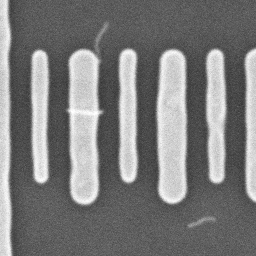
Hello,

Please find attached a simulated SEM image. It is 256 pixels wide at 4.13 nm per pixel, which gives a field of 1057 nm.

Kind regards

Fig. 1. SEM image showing groups of lines, slits or small figures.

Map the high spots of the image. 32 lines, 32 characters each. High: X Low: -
X-------------------------------
X-------------------------------
X-------------------------------
X-------------------------------
X-------------------------------
X-------------------------------
X---------X-----X----X----X----X
X---XX---XXX---XX---XXX---XX---X
X---XX---XXX---XX---XXX---XX---X
X---XX---XXX---XX---XXX---XX---X
X---XX---XXX---XX---XXX---XX---X
X---XX---XXX---XX---XXX---XX---X
X---XX---XXX---XX---XXX---XX---X
X---XX---XXX---XX---XXX---XX---X
X---XX---XXX---XX---XXX---XX---X
X---XX---XXX---XX---XXX---XX---X
X---XX---XXX---XX---XXX---XX---X
X---XX---XXX---XX---XXX---XX---X
X---XX---XXX---XX---XXX---XX---X
X---XX---XXX---XX---XXX---XX---X
X---XX---XXX---XX---XXX---XX---X
X---XX---XXX---XX---XXX---XX---X
X----X---XXX----X---XXX----X---X
X--------XXX--------XXX--------X
X--------XXX--------XXX--------X
X-------------------------------
X-------------------------------
X-------------------------------
X-------------------------------
X-------------------------------
X-------------------------------
X-------------------------------